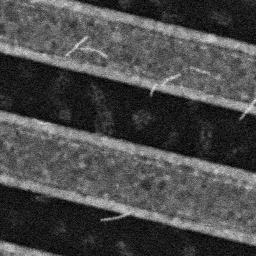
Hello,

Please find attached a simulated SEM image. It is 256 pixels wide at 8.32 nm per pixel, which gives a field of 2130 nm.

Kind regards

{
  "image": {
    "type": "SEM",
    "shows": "one or a few lines or trenches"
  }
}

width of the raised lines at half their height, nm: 490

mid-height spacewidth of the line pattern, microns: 0.563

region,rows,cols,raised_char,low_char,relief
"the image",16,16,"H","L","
HHHHHLLLLLLLLLLL
HHHHHHHHHLLLLLLL
HHHHHHHHHHHHHLLL
LLHHHHHHHHHHHHHH
LLLLLLLHHHHHHHHH
LLLLLLLLLLLHHHHH
LLLLLLLLLLLLLLLH
HLLLLLLLLLLLLLLL
HHHHHLLLLLLLLLLL
HHHHHHHHHLLLLLLL
HHHHHHHHHHHHHLLL
LLHHHHHHHHHHHHHH
LLLLLLHHHHHHHHHH
LLLLLLLLLLHHHHHH
LLLLLLLLLLLLLLHH
LLLLLLLLLLLLLLLL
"